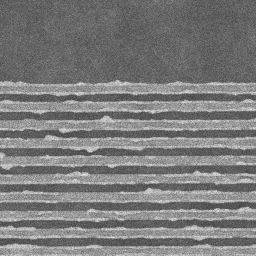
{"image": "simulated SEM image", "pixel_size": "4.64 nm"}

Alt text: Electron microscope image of parallel lines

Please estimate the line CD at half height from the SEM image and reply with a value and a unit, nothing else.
9.76 px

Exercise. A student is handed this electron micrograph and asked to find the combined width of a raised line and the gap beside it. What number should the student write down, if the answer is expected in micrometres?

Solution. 0.0839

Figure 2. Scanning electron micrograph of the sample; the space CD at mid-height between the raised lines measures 37.7 nanometres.